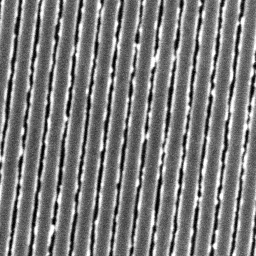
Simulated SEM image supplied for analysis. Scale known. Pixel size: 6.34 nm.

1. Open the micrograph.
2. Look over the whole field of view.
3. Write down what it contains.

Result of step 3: parallel lines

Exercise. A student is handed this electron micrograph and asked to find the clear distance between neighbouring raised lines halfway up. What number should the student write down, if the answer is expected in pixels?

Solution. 3.6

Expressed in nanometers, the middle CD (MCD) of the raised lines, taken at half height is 102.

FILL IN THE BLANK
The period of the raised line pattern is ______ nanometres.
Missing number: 127